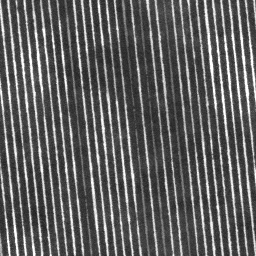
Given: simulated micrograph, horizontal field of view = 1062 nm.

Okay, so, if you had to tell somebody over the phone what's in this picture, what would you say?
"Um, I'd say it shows parallel lines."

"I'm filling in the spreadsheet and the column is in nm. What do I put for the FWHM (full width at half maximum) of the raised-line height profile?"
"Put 6.2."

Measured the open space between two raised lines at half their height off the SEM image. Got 6.58 pixels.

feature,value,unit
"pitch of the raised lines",0.0339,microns